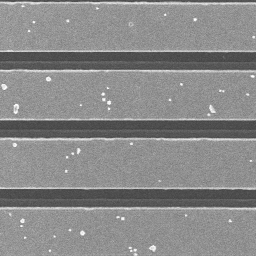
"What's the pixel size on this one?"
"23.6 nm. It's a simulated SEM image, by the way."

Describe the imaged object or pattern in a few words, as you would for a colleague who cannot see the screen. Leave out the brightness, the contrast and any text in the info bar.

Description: lines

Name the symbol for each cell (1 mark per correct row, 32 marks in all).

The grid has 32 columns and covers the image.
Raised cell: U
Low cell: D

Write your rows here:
UUUUUUUUUUUUUUUUUUUUUUUUUUUUUUUU
UUUUUUUUUUUUUUUUUUUUUUUUUUUUUUUU
UUUUUUUUUUUUUUUUUUUUUUUUUUUUUUUU
UUUUUUUUUUUUUUUUUUUUUUUUUUUUUUUU
UUUUUUUUUUUUUUUUUUUUUUUUUUUUUUUU
UUUUUUUUUUUUUUUUUUUUUUUUUUUUUUUU
DDDDDDDDDDDDDDDDDDDDDDDDDDDDUDDD
DDDDDDDDDDDDDDDDDDDDDDDDDDDDDDDD
DDDDDDDDDDDDDDDDDDDDDDDDDDDDDDDD
UUUUUUUUUUUUUUUUUUUUUUUUUUUUUUUU
UUUUUUUUUUUUUUUUUUUUUUUUUUUUUUUU
UUUUUUUUUUUUUUUUUUUUUUUUUUUUUUUU
UUUUUUUUUUUUUUUUUUUUUUUUUUUUUUUU
UUUUUUUUUUUUUUUUUUUUUUUUUUUUUUUU
UUUUUUUUUUUUUUUUUUUUUUUUUUUUUUUU
DDDDDDDDDDDDDDDDDDDDDDDDDDDDDDDD
DDDDDDDDDDDDDDDDDDDDDDDDDDDDDDDD
UUUUUUUUUUUUUUUUUUUUUUUUUUUUUUUU
UUUUUUUUUUUUUUUUUUUUUUUUUUUUUUUU
UUUUUUUUUUUUUUUUUUUUUUUUUUUUUUUU
UUUUUUUUUUUUUUUUUUUUUUUUUUUUUUUU
UUUUUUUUUUUUUUUUUUUUUUUUUUUUUUUU
UUUUUUUUUUUUUUUUUUUUUUUUUUUUUUUU
UUUUUUUUUUUUUUUUUUUUUUUUUUUUUUUU
DDDDDDDDDDDDDDDDDDDDDDDDDDDDDDDD
DDDDDDDDDDDDDDDDDDDDDDDDDDDDDDDD
UUUUUUUUUUUUUUUUUUUUUUUUUUUUUUUU
UUUUUUUUUUUUUUUUUUUUUUUUUUUUUUUU
UUUUUUUUUUUUUUUUUUUUUUUUUUUUUUUU
UUUUUUUUUUUUUUUUUUUUUUUUUUUUUUUU
UUUUUUUUUUUUUUUUUUUUUUUUUUUUUUUU
UUUUUUUUUUUUUUUUUUUUUUUUUUUUUUUU